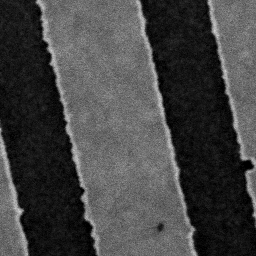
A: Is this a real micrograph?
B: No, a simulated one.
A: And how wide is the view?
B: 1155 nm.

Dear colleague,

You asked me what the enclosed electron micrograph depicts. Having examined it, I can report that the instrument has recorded one or a few lines or trenches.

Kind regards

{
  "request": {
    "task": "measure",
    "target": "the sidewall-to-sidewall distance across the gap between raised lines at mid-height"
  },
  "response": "308 nm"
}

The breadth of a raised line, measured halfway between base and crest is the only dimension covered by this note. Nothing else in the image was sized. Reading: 434 nm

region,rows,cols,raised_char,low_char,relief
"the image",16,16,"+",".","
...++++++....+++
...++++++....+++
...++++++.....++
...++++++.....++
....++++++....++
....++++++....++
....++++++....++
....++++++.....+
....+++++++....+
.....++++++....+
+....++++++.....
+....++++++....+
+....++++++.....
+....+++++++....
+.....++++++....
++....++++++....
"